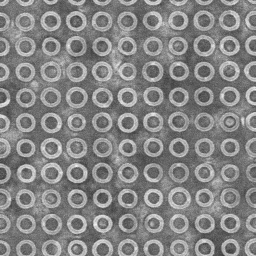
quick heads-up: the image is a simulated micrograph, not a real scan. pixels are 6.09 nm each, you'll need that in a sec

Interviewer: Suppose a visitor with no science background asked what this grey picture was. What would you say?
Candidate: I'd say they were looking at a regular array of ring-shaped raised bodies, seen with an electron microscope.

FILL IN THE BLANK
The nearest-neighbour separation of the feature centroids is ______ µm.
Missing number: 0.153